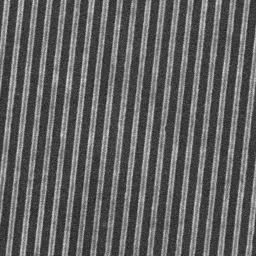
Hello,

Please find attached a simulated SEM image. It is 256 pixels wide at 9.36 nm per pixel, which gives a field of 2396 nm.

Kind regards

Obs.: parallel lines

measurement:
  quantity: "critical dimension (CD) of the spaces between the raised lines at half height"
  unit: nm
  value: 82.6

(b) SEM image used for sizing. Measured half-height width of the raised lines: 48.8 nanometers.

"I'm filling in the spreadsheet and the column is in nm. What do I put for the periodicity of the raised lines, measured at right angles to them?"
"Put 131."